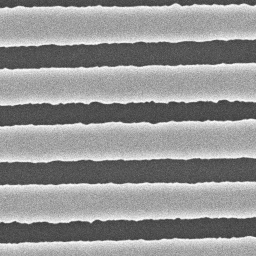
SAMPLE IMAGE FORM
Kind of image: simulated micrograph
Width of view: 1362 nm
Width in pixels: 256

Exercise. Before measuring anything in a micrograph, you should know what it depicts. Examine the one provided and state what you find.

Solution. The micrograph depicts lines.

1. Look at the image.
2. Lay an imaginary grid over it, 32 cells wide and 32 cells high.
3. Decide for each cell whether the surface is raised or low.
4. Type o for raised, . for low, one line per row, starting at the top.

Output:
..............................o.
oooooooooooooooooooooooooooooooo
oooooooooooooooooooooooooooooooo
oooooooooooooooooooooooooooooooo
oooooooooooooooooooooooooooooooo
oooooooooooo....................
................................
................................
..........oooooooooooooooooooooo
oooooooooooooooooooooooooooooooo
oooooooooooooooooooooooooooooooo
oooooooooooooooooooooooooooooooo
oooooooooooooooooooooooooooooooo
................................
................................
.........o.ooooooooooooooooooooo
oooooooooooooooooooooooooooooooo
oooooooooooooooooooooooooooooooo
oooooooooooooooooooooooooooooooo
oooooooooooooooooooooooooooooooo
................................
................................
................................
oooooooooooooooooooooooooooooooo
oooooooooooooooooooooooooooooooo
oooooooooooooooooooooooooooooooo
oooooooooooooooooooooooooooooooo
oooooooooooo.o..................
................................
................................
oooooooooooooooooooooooooooooooo
oooooooooooooooooooooooooooooooo